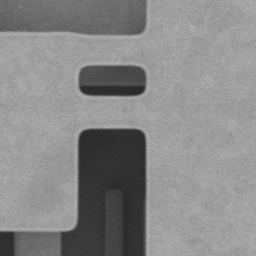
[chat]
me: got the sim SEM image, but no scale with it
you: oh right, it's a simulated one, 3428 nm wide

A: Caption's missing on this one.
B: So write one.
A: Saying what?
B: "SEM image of wiring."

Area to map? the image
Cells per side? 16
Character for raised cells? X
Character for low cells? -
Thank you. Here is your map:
---------XXXXXXX
---------XXXXXXX
XXXXXXXXXXXXXXXX
XXXXXXXXXXXXXXXX
XXXXX----XXXXXXX
XXXXX----XXXXXXX
XXXXXXXXXXXXXXXX
XXXXXXXXXXXXXXXX
XXXXX----XXXXXXX
XXXXX----XXXXXXX
XXXXX----XXXXXXX
XXXXX----XXXXXXX
XXXXX----XXXXXXX
XXXXX----XXXXXXX
---------XXXXXXX
---------XXXXXXX